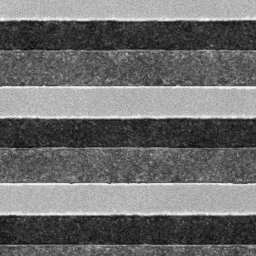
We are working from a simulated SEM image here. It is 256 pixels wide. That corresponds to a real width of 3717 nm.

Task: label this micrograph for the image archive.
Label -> lines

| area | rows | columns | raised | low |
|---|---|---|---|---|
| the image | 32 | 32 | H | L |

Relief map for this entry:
HHHHHHHHHHHHHHHHHHHHHHHHHHHHHHHH
HHHHHHHHHHHHHHHHHHHHHHHHHHHHHHHH
HHHLHHLHHHHHLHHHHHHHHHLLHHHHHLLL
LLLLLLLLLLLLLLLLLLLLLLLLLLLLLLLL
LLLLLLLLLLLLLLLLLLLLLLLLLLLLLLLL
LLLLLLLLLLLLLLLLLLLLLLLLLLLLLLLL
HHHHHHHHHHHHHHHHHHHHHHHHHHHHHHHH
HHHHHHHHHHHHHHHHHHHHHHHHHHHHHHHH
HHHHHHHHHHHHHHHHHHHHHHHHHHHHHHHH
HHHHHHHHHHHHHHHHHHHHHHHHHHHHHHHH
HHHHHHHHHHHHHHHHHHHHHHHHHHHHHHHH
HHHHHHHHHHHHHHHHHHHHHHHHHHHHHHHH
HHHHHHHHHHHHHHHHHHHHHHHHHHHHHHHH
HHHHHHHHHHHHHHHHHHHHHHHHHHHHHHHH
HHHHHHHHHHHHHHHHHHHHHHHHHHHHHHHH
LLLLLLLLLLLLLLLLLLLLLLLLLLLLLLLL
LLLLLLLLLLLLLLLLLLLLLLLLLLLLLLLL
LLLLLLLLLLLLLLLLLLLLLLLLLLLLLLLL
LLLLLLLLLLLLLLLLLLLLLLLLLLLLLLLL
HHHHHHHHHHHHHHHHHHHHHHHHHHHHHHHH
HHHHHHHHHHHHHHHHHHHHHHHHHHHHHHHH
HHHHHHHHHHHHHHHHHHHHHHHHHHHHHHHH
HHHHHHHHHHHHHHHHHHHHHHHHHHHHHHHH
HHHHHHHHHHHHHHHHHHHHHHHHHHHHHHHH
HHHHHHHHHHHHHHHHHHHHHHHHHHHHHHHH
HHHHHHHHHHHHHHHHHHHHHHHHHHHHHHHH
HHHHHHHHHHHHHHHHHHHHHHHHHHHHHHHH
LLLLLLLLLLLLLLLLLLLLLLLLLLLLLLLL
LLLLLLLLLLLLLLLLLLLLLLLLLLLLLLLL
LLLLLLLLLLLLLLLLLLLLLLLLLLLLLLLL
LLLLLLLLLLLLLLLLLLLLLLLLLLLLLLLL
HHHHHHHHHHHHHHHHHHHHHHHHHHHHHHHH